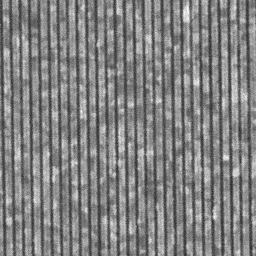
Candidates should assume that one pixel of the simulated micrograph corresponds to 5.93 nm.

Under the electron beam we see parallel lines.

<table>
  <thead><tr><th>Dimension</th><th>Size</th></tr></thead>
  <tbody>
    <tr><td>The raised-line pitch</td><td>9.48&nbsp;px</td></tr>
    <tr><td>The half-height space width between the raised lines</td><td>0.0252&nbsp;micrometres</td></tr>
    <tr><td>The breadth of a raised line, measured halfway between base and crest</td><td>34.9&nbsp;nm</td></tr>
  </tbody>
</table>